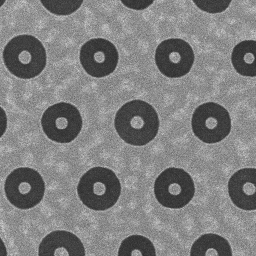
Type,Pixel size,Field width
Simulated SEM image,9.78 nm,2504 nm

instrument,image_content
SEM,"a regular array of ring-shaped grooves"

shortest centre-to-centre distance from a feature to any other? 727 nm